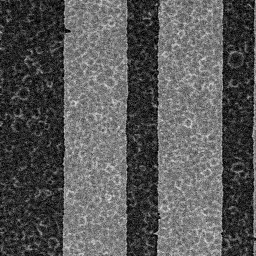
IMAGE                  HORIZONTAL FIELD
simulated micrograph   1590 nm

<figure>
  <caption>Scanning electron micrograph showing one or a few lines or trenches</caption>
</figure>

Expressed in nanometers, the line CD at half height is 378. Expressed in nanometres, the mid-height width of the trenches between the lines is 200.